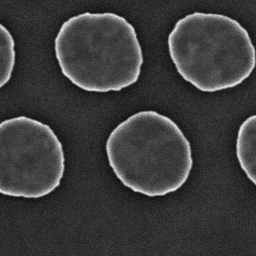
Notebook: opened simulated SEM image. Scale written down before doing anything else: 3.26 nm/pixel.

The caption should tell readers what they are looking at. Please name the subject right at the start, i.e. raised bodies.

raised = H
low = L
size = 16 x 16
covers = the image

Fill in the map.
LLLLLLLLLLLLLLLL
LLLLHHHHLLLHHHHL
HLLLHHHHHLLHHHHH
HLLLHHHHHLLHHHHH
HLLLHHHHHLLHHHHH
LLLLLHHHLLLLHHLL
LLLLLLLLLLLLLLLL
LHLLLLLLHHHLLLLL
HHHLLLLHHHHLLLLH
HHHHLLLHHHHHLLLH
HHHHLLLHHHHHLLLH
HHHHLLLLHHHLLLLL
LLLLLLLLLLLLLLLL
LLLLLLLLLLLLLLLL
LLLLLLLLLLLLLLLL
LLLLLLLLLLLLLLLL